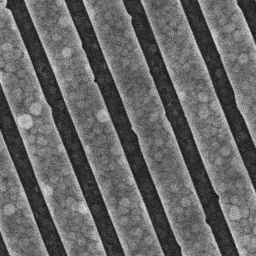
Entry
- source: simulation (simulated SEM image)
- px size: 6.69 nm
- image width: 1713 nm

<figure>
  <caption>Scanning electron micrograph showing parallel lines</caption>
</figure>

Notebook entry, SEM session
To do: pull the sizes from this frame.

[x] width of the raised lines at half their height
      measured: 245 nm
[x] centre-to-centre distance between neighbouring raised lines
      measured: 53.6 pixels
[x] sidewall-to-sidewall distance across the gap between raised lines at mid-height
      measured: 111 nm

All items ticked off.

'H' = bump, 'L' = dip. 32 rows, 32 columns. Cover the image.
HLLHHHHHLLHHHHHLLLHHHHHLLHHHHHLL
HLLLHHHHHLLHHHHHLLHHHHHLLHHHHHLL
HHLLHHHHHLLHHHHHLLLHHHHLLLHHHHHL
HHLLHHHHHLLLHHHHHLLHHHHHLLHHHHHL
HHHLLHHHHHLLHHHHHLLHHHHHLLHHHHHL
HHHLLHHHHHLLHHHHHLLLHHHHHLLHHHHH
HHHLLLHHHHHLLHHHHHLLHHHHHLLHHHHH
HHHHLLHHHHHLLHHHHHLLHHHHHLLLHHHH
HHHHLLHHHHHLLLHHHHHLLHHHHHLLHHHH
HHHHHLLHHHHHLLHHHHHLLHHHHHLLHHHH
HHHHHLLHHHHHLLHHHHHLLLHHHHHLLHHH
LHHHHLLLHHHHHLLHHHHHLLHHHHHLLHHH
LHHHHHLLHHHHHLLHHHHHLLHHHHHLLHHH
LHHHHHLLHHHHHLLLHHHHLLLHHHHHLLHH
LLHHHHHLLHHHHHLLHHHHHLLHHHHHLLHH
LLHHHHHLLHHHHHLLHHHHHLLLHHHHHLLH
LLHHHHHLLLHHHHHLLHHHHHLLHHHHHLLH
LLLHHHHHLLHHHHHLLHHHHHLLHHHHHLLL
HLLHHHHHLLHHHHHLLLHHHHLLLHHHHHLL
HLLLHHHHLLLHHHHHLLHHHHHLLHHHHHLL
HHLLHHHHHLLHHHHHLLHHHHHLLHHHHHLL
HHLLHHHHHLLLHHHHLLLHHHHLLLHHHHHL
HHLLLHHHHHLLHHHHHLLHHHHHLLHHHHHL
HHHLLHHHHHLLHHHHHLLHHHHHLLLHHHHH
HHHLLHHHHHLLLHHHHHLLHHHHHLLHHHHH
HHHHLLHHHHHLLHHHHHLLHHHHHLLHHHHH
HHHHLLHHHHHLLLHHHHLLLHHHHLLLHHHH
HHHHLLLHHHHHLLHHHHHLLHHHHHLLHHHH
HHHHHLLHHHHHLLHHHHHLLHHHHHLLLHHH
HHHHHLLHHHHHLLLHHHHHLLHHHHHLLHHH
LHHHHLLLHHHHHLLHHHHHLLHHHHHLLHHH
LHHHHHLLHHHHHLLHHHHHLLLHHHHHLLHH